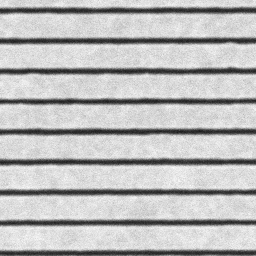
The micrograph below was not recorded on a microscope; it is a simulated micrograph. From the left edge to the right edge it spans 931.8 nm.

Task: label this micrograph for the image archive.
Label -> parallel lines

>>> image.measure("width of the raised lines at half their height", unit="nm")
85.2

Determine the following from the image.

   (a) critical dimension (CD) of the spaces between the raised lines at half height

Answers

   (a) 0.0273 µm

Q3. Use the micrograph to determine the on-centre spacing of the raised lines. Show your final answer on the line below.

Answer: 0.111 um